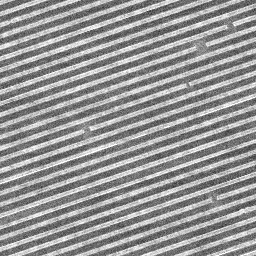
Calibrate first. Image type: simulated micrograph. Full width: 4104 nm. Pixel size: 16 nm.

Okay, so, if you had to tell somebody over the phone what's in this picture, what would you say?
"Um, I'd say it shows parallel lines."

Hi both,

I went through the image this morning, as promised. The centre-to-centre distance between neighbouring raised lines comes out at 170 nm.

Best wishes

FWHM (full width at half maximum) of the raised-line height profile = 58.8 nm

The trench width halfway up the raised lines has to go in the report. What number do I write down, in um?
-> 0.102